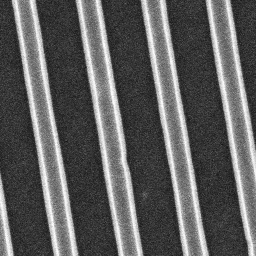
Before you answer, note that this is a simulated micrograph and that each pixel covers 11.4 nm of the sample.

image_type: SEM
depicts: parallel lines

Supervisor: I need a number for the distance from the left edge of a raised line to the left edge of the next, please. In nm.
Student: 728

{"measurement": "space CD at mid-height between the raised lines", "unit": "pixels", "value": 44.3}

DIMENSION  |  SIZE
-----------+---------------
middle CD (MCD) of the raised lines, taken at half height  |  221 nm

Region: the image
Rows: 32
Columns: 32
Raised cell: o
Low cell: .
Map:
..oo......oo......oo......ooo...
..oo......ooo.....ooo.....ooo...
..ooo.....ooo.....ooo.....ooo...
..ooo.....ooo......oo.....ooo...
..ooo......oo......oo......oo...
...oo......oo......oo......oo...
...oo......oo......oo......ooo..
...oo......ooo.....ooo.....ooo..
...ooo.....ooo.....ooo.....ooo..
...ooo.....ooo.....ooo.....ooo..
...ooo......oo......oo......oo..
....oo......oo......oo......oo..
....oo......oo......oo......ooo.
....oo......ooo.....ooo.....ooo.
....ooo.....ooo.....ooo.....ooo.
....ooo.....ooo.....ooo......oo.
....ooo......oo......oo......oo.
.....oo......oo......oo......oo.
.....oo......oo......oo......ooo
.....oo......ooo.....ooo.....ooo
.....ooo.....ooo.....ooo.....ooo
.....ooo.....ooo......oo......oo
.....ooo.....ooo......oo......oo
......oo......oo......oo......oo
......oo......oo......oo......oo
......oo......oo......ooo.....oo
o.....ooo.....ooo.....ooo.....oo
o.....ooo.....ooo.....ooo......o
o......oo.....ooo......oo......o
o......oo......oo......oo......o
o......oo......oo......oo......o
o......oo......oo......ooo.....o